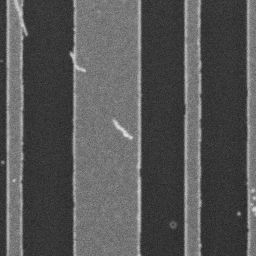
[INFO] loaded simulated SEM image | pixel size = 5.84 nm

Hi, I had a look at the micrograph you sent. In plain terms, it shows lines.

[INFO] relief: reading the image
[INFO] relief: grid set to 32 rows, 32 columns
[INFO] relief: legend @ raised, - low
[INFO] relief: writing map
-@@------@@@@@@@@@-----@@------@
-@@------@@@@@@@@@-----@@------@
-@@------@@@@@@@@@-----@@------@
-@@------@@@@@@@@------@@------@
-@@------@@@@@@@@------@@------@
-@@------@@@@@@@@------@@------@
-@@------@@@@@@@@@-----@@------@
-@@------@@@@@@@@@-----@@------@
-@@------@@@@@@@@@-----@@------@
-@@------@@@@@@@@------@@------@
-@@------@@@@@@@@@-----@@------@
-@@------@@@@@@@@@-----@@------@
-@@------@@@@@@@@@-----@@------@
-@@------@@@@@@@@------@@------@
-@@------@@@@@@@@------@@------@
-@@------@@@@@@@@------@@------@
-@@------@@@@@@@@@-----@@------@
-@@------@@@@@@@@@-----@@------@
-@@------@@@@@@@@------@@------@
-@@------@@@@@@@@------@@------@
-@@------@@@@@@@@------@@------@
-@@------@@@@@@@@------@@------@
-@@------@@@@@@@@------@@------@
-@@------@@@@@@@@------@@------@
-@@------@@@@@@@@------@@------@
-@@------@@@@@@@@------@@------@
-@@------@@@@@@@@------@@------@
-@@------@@@@@@@@------@@------@
-@@------@@@@@@@@------@@------@
-@@------@@@@@@@@------@@------@
-@@------@@@@@@@@------@@------@
-@@------@@@@@@@@------@@------@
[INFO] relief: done